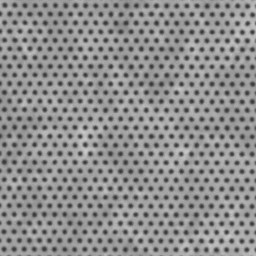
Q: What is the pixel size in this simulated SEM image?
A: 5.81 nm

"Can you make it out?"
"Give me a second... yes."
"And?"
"a regular array of holes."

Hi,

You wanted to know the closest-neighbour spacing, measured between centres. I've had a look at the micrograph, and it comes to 9.78 px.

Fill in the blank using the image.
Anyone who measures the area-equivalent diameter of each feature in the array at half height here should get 4.78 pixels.